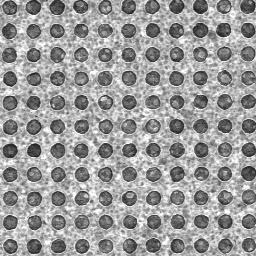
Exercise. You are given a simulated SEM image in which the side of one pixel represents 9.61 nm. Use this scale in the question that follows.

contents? a regular array of holes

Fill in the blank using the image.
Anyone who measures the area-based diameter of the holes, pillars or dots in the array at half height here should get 141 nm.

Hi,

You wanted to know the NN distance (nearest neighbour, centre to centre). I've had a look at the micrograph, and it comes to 225 nm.